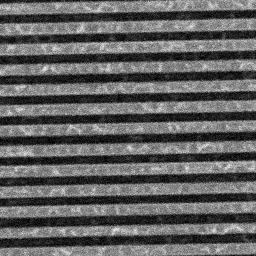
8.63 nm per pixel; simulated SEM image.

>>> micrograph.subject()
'parallel lines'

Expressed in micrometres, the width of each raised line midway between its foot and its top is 0.0917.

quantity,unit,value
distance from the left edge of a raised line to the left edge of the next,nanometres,176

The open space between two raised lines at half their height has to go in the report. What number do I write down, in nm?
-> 84.1